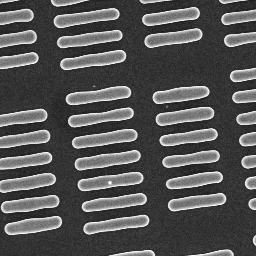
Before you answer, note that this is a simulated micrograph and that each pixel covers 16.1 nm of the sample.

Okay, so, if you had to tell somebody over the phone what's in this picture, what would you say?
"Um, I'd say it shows groups of lines, slits or small figures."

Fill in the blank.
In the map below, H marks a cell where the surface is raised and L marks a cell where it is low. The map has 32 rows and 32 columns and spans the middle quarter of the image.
HHHHHHHLLLLLLLLLLLLLLLLLLLLLLLLL
LLLLLLLLLLLLLLLLLLLLLLLLLLLLLLLL
LLLLLLLLLLLLLLLLLLLLLLLLLLLLLLLL
LLLLLLLLLLLLLLLLLLLLLLLLLLLLLLLL
LLLLLLLLLLLLLLLLLLLLLLLLLLLLLLLL
LLLLLLLLLLLLLLLLLLLLLLLLLLLLLLLL
LLLLLLLLLHHHHHHHHLLLLLLLLLHHHHHH
LHHHHHHHHHHHHHHHHLLLLLHHHHHHHHHH
LHHHHHHHHHHHHHHHLLLLLLHHHHHHHHHH
LHHHHHHLLLLLLLLLLLLLLLLHHHHLLLLL
LLLLLLLLLLLLLLLLLLLLLLLLLLLLLLLL
LLLLLLLLLLLLHHHHHLLLLLLLLLLLLLHH
LLLLLLLHHHHHHHHHHLLLLLLLHHHHHHHH
LHHHHHHHHHHHHHHHHLLLLLLHHHHHHHHH
LHHHHHHHHHLLLLLLLLLLLLLHHHHHHHHL
LLHHLLLLLLLLLLLLLLLLLLLLLLLLLLLL
LLLLLLLLLLLLLLLHHLLLLLLLLLLLLLLL
LLLLLLLLLHHHHHHHHHLLLLLLLLLHHHHH
LLLHHHHHHHHHHHHHHHLLLLLLHHHHHHHH
LLHHHHHHHHHHHHHLLLLLLLLLHHHHHHHH
LLHHHHHLLLLLLLLLLLLLLLLLLLLLLLLL
LLLLLLLLLLLLLLLLLLLLLLLLLLLLLLLL
LLLLLLLLLLLLLHHHHHHLLLLLLLLLLLLL
LLLLLHHHHHHHHHHHHHHLLLLLLHHHHHHH
LLLHHHHHHHHHHHHHHLLLLLLLLHHHHHHH
LLLHHHHHHHHHLLLLLLLLLLLLLHHHHLLL
LLLLLLLLLLLLLLLLLLLLLLLLLLLLLLLL
LLLLLLLLLLLLLLHHHHHLLLLLLLLLLLLL
LLLLLLLHHHHHHHHHHHHHLLLLLLLHHHHH
LLLLHHHHHHHHHHHHHHHLLLLLLLHHHHHH
LLLLHHHHHHHHHLLLLLLLLLLLLLHHHHHH
LLLLHHHLLLLLLLLLLLLLLLLLLLLLLLLL